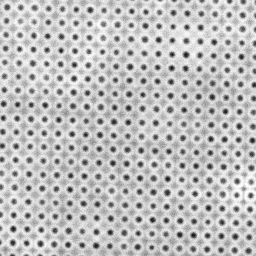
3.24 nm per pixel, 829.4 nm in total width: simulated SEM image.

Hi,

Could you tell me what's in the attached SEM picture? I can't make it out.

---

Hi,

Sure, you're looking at a regular array of holes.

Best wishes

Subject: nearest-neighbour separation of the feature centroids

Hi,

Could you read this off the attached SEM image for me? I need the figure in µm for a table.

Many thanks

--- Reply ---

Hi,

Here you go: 0.0441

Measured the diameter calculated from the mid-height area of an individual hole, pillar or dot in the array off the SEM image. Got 7.19 px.